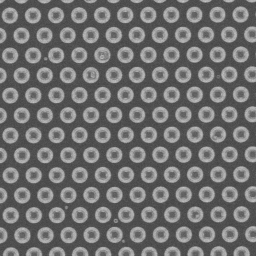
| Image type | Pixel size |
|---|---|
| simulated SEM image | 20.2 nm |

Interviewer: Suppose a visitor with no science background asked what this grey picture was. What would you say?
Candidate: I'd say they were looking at an array of small figures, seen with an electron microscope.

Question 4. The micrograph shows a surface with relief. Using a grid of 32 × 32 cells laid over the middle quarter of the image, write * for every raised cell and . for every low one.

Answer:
................................
**...***...***...***...***..***.
***..****..***..****..****..****
***..***...***..****..****..****
**....**...***...**....**....**.
................................
..***...***...***...***..****..*
..****..****..***..****..****..*
..****..***...***..****..****..*
...**....*....**....**....**....
................................
**...***...***...***...***..***.
***..****..***..****..****..****
***..****..***..****..****..****
**....**....*.....*....**....**.
................................
..***...***...***...***..****..*
..****..***...***..****..****..*
..****..***...***..****..****..*
...**....**....*....**....**....
................................
**...***...***...***...***..***.
***..****..***...***..****..****
***..****..***...***..****..****
**....**....*.....*....**....*..
................................
...**...***...***...***..****..*
..****..****..***..****..****..*
..****..****..***..****..****..*
...**....**....*.....*....**....
................................
**...***...***...***...***..****